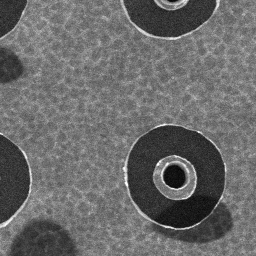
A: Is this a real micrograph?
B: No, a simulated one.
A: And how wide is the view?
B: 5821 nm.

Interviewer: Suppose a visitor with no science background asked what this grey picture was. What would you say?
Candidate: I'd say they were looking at ring-shaped grooves with a dot in the middle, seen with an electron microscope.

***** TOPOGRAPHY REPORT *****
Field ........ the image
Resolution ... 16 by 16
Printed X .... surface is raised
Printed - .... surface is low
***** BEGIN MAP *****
--XXXXXX-----XXX
-XXXXXXX-----XXX
XXXXXXXXXXXXXXXX
XXXXXXXXXXXXXXXX
XXXXXXXXXXXXXXXX
XXXXXXXXXXXXXXXX
XXXXXXXXXXXXXXXX
XXXXXXXXXXXXXXXX
XXXXXXXXX----XXX
-XXXXXXX------XX
--XXXXXX---X--XX
--XXXXXX---X--XX
--XXXXXX------XX
-XXXXXXXX----XXX
XXXXXXXXXXXXXXXX
XXXXXXXXXXXXXXXX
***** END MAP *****